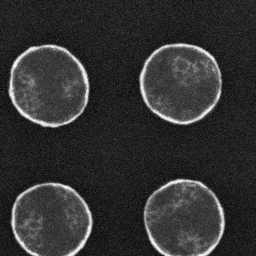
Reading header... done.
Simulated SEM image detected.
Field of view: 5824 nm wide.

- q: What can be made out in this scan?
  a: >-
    raised bodies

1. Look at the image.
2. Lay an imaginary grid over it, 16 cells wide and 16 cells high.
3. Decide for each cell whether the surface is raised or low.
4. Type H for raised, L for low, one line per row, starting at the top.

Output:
LLLLLLLLLLLLLLLL
LLLLLLLLLLLLLLLL
LLLLLLLLLLLLLLLL
LHHHHLLLLHHHHLLL
LHHHHLLLLHHHHHLL
LHHHHLLLLHHHHHLL
LHHHHLLLLHHHHLLL
LLHHLLLLLLLHLLLL
LLLLLLLLLLLLLLLL
LLLLLLLLLLLLLLLL
LLLLLLLLLLLLLLLL
LLLLLLLLLLLHHLLL
LHHHHLLLLHHHHHLL
LHHHHHLLLHHHHHLL
LHHHHHLLLHHHHHLL
LLHHHLLLLLHHHLLL